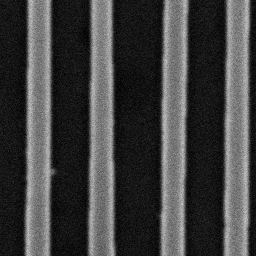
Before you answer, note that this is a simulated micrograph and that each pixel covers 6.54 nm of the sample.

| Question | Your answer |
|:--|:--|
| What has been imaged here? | lines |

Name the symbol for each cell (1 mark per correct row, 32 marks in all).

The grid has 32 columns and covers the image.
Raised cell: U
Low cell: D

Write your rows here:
DDDDUUDDDDDDUUDDDDDDDUUDDDDDUUUD
DDDDUUDDDDDDUUDDDDDDDUUDDDDDUUUD
DDDDUUDDDDDDUUDDDDDDDUUDDDDDUUUD
DDDDUUDDDDDDUUDDDDDDDUUDDDDDUUUD
DDDDUUDDDDDDUUDDDDDDDUUDDDDDUUUD
DDDDUUDDDDDDUUDDDDDDDUUDDDDDUUUD
DDDDUUDDDDDDUUDDDDDDDUUDDDDDUUUD
DDDDUUDDDDDDUUDDDDDDUUUDDDDDUUUD
DDDDUUDDDDDDUUDDDDDDUUUDDDDDUUUD
DDDDUUDDDDDDUUDDDDDDUUUDDDDDUUUD
DDDDUUDDDDDDUUDDDDDDUUUDDDDDUUUD
DDDDUUDDDDDUUUDDDDDDUUUDDDDDUUUD
DDDDUUDDDDDUUUDDDDDDUUUDDDDDUUUD
DDDDUUDDDDDUUUDDDDDDUUUDDDDDUUUD
DDDDUUDDDDDUUUDDDDDDUUUDDDDDUUUD
DDDDUUDDDDDUUUDDDDDDUUUDDDDDUUUD
DDDDUUDDDDDUUUDDDDDDUUUDDDDDUUUD
DDDDUUDDDDDUUUDDDDDDUUUDDDDDUUUD
DDDDUUDDDDDUUUDDDDDDUUUDDDDDUUUD
DDDDUUDDDDDUUUDDDDDDUUUDDDDDUUUD
DDDDUUDDDDDUUUDDDDDDUUUDDDDDUUUD
DDDDUUDDDDDUUUDDDDDDUUUDDDDDUUUD
DDDDUUDDDDDUUUDDDDDDUUUDDDDDUUUD
DDDDUUDDDDDUUUDDDDDDUUUDDDDDUUUD
DDDUUUDDDDDUUUDDDDDDUUUDDDDDUUUD
DDDUUUDDDDDUUUDDDDDDUUUDDDDDUUUD
DDDUUUDDDDDUUUDDDDDDUUUDDDDDUUUD
DDDUUUDDDDDUUUDDDDDDUUUDDDDDUUUD
DDDUUUDDDDDUUUDDDDDDUUUDDDDDUUUD
DDDUUUDDDDDUUUDDDDDDUUUDDDDDUUUD
DDDUUUDDDDDUUUDDDDDDUUUDDDDDUUUD
DDDUUUDDDDDUUUDDDDDDUUUDDDDDUUUD